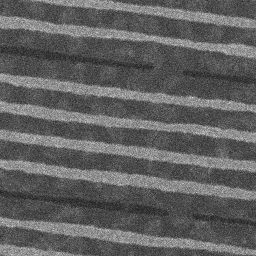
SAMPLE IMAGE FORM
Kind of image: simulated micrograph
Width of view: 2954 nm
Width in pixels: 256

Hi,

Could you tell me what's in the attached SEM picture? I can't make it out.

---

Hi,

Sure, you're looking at parallel lines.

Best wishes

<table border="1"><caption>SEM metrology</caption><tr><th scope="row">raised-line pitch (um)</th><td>0.328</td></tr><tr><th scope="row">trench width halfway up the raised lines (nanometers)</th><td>228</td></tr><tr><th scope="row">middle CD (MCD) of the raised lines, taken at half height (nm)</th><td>96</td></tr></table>